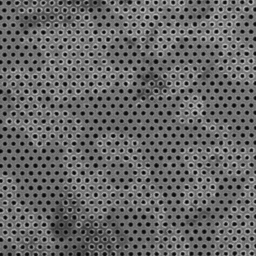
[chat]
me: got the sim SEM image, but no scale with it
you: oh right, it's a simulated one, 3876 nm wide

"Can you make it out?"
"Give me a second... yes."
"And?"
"a regular array of holes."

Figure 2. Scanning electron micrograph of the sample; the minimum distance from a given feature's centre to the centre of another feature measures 126 nm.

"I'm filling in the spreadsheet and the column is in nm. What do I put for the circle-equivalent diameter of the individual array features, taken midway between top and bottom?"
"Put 66.2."